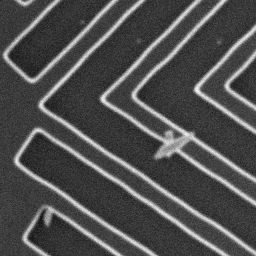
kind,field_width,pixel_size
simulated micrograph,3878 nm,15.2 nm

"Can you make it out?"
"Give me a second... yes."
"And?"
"groups of lines, slits or small figures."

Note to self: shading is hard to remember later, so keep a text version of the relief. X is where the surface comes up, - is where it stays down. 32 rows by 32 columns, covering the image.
XXXXXXX-------XXX-------XXXX----
XXXXXX-------XXX-------XXXX-----
XXXXX-------XXX-------XXXX------
XXXX-------XXX-------XXXX-------
XXX-------XXX-------XXXX-------X
XX-------XXX-------XXXX-------XX
X-------XXX-------XXXX-------XXX
X------XXX-------XXXX-------XXX-
XX----XXX--------XXX-------XXX--
XXX--XXX--------XXX-------XXX---
XXXXXXX-------XXXX-------XXX----
XXXXXXX------XXXX--------XXXX---
XXXXXX-------XXXX---------XXXX--
XXXXX---------XXXX----------XXXX
XXXXXXX---------XXXX---------XXX
XXXXXXXX---------XXXX---------XX
XXXX-XXXXX---------XXXX---------
XXXX---XXXX---------XXXX--------
XXX-----XXXX--------XXXXXX------
XX--------XXXX---------XXXX-----
XX---------XXXXX---------XXXX---
XXXX---------XXXX---------XXXX--
XXXXX---------XXXXX---------XXXX
XXXXXXX---------XXXX---------XXX
XXXXXXXX---------XXXX---------XX
XXXXXXXXXX---------XXXX---------
XXXXX-XXXXX---------XXXX--------
XXXX----XXXX----------XXXX------
XXXX------XXXX---------XXXXX----
XXX--------XXXXX--------XXXXX---
XXXX---------XXXX---------XXXX--
XXXXX---------XXXXX--------XXXXX